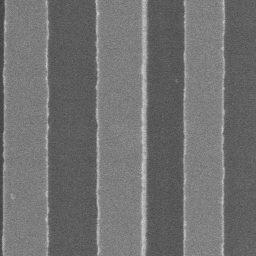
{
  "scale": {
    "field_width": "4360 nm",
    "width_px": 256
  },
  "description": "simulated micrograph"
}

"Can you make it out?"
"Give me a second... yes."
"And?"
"lines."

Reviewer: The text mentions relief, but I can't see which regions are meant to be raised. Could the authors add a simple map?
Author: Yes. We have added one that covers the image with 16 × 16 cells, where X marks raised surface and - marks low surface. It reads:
XXX---XXX---XX--
XXX---XXX---XX--
XXX---XXX---XX--
XXX---XXX---XX--
XXX---XXX---XX--
XXX---XXX---XX--
XXX---XXX---XX--
XXX---XXX---XX--
XXX---XXX---XX--
XXX---XXX---XX--
XXX---XXX---XX--
XXX---XXX---XX--
XXX---XXX---XX--
XXX---XXX---XX--
XXX---XXX---XX--
XXX---XXX---XX--